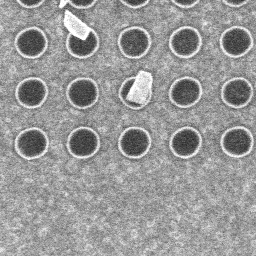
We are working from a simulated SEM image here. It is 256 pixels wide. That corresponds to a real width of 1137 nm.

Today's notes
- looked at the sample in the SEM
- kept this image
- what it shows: a regular array of raised bodies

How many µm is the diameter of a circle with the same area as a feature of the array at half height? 0.139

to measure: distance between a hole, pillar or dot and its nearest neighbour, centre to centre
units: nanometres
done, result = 221